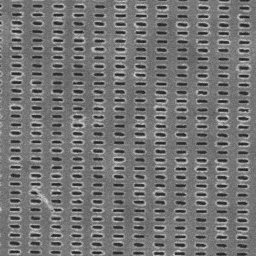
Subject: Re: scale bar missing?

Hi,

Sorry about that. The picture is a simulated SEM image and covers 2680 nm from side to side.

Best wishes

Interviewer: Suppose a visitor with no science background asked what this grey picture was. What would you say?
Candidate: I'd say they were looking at a regular array of holes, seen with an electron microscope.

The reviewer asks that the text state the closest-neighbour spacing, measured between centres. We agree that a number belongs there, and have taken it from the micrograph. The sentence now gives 0.0884 microns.